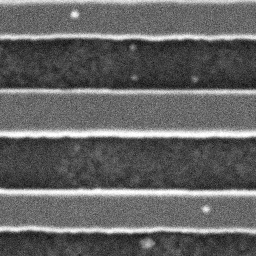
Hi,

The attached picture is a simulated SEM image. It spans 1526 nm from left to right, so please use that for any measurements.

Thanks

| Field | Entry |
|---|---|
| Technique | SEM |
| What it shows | lines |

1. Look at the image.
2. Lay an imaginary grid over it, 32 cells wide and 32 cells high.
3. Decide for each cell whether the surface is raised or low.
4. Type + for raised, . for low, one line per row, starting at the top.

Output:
++++++++++++++++++++++++++++++++
++++++++++++++++++++++++++++++++
++++++++++++++++++++++++++++++++
++++++++++++++++++++++++++++++++
++++++++++++++++++++++++++++++++
................................
................................
................................
................................
................................
................................
++++++++++++++++++++++++++++++++
++++++++++++++++++++++++++++++++
++++++++++++++++++++++++++++++++
++++++++++++++++++++++++++++++++
++++++++++++++++++++++++++++++++
++++++++++++++++++++++++++++++++
................................
................................
................................
................................
................................
................................
................................
++++++++++++++++++++++++++++++++
++++++++++++++++++++++++++++++++
++++++++++++++++++++++++++++++++
++++++++++++++++++++++++++++++++
++++++++++++++++++++++++++++++++
................................
................................
................................